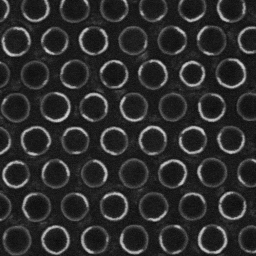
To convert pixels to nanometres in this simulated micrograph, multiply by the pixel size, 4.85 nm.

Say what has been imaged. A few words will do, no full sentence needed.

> a regular array of raised bodies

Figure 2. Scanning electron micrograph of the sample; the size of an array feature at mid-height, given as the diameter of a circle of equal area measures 137 nm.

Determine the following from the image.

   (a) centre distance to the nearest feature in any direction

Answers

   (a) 185 nanometres